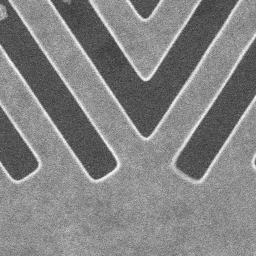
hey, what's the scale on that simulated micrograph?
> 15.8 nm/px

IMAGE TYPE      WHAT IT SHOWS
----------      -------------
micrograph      groups of lines, slits or small figures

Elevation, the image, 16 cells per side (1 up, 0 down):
0110001100110001
0011000111110011
0011100111100111
0001100011000110
1000110001001110
1100111000011100
1110011000011000
0110001100111001
0111001111110011
0011100111100011
0011100111100111
1111111111111111
1111111111111111
1111111111111111
1111111111111111
1111111111111111